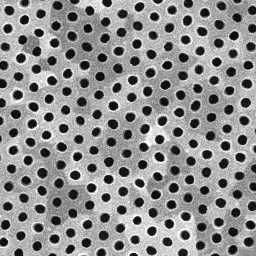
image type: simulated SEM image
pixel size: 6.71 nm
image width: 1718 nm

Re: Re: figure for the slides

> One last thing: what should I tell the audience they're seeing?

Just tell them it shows a regular array of holes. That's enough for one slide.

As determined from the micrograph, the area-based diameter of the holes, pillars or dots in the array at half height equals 65.5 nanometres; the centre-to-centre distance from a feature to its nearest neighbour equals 119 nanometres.